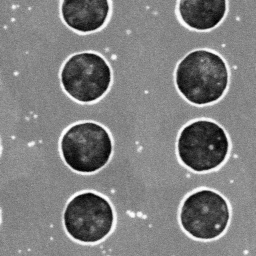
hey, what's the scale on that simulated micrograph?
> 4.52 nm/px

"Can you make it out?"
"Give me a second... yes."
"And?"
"holes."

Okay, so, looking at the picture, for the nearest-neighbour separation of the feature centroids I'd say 314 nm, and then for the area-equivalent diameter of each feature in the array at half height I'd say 228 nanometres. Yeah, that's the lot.